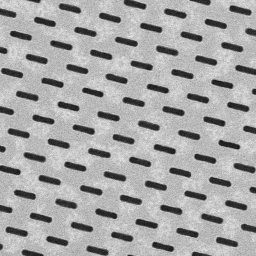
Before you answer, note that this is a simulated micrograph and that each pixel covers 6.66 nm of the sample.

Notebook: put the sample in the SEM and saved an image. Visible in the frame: a regular array of holes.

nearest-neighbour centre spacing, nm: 184